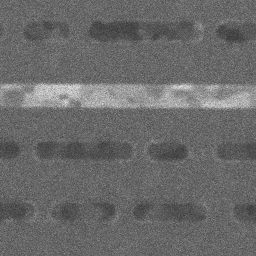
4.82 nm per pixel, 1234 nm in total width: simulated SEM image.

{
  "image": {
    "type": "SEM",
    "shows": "parallel lines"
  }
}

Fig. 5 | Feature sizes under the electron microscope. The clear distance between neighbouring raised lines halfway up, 196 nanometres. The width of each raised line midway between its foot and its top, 99.9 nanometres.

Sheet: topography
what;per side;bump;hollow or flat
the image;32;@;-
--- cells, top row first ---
--------------------------------
--------------------------------
----@@@@----@-------------------
@--@@@@@@--@@@@@@@@@@@@@@--@@@@@
@--@@@@@@--@@@@@@@@@@@@@@--@@@@@
--------------------------------
--------------------------------
--------------------------------
--------------------------------
--------------------------------
--------------------------------
@@@@@@@@@@@@@@@@@@@@@@@@@@@@@@@@
@@@@@@@@@@@@@@@@@@@@@@@@@@@@@@@@
--------------------------------
--------------------------------
--------------------------------
--------------------------------
--------------------------------
@@@-@@@@@@@@@@@@@-@@@@@@---@@@@@
@@--@@@@@@@@@@@@@-@@@@@@---@@@@@
--------------------------------
--------------------------------
--------------------------------
--------------------------------
--------------------------------
@@@@---@@@@@@@---@@@@@@@@@---@@@
@@@@@-@@@@@@@@@--@@@@@@@@@---@@@
@@@@---@@@@@@@---@@@@@@@@@---@@@
--------------------------------
--------------------------------
--------------------------------
--------------------------------